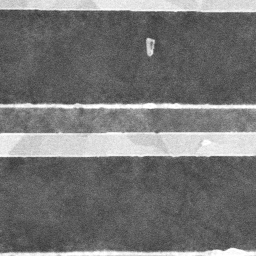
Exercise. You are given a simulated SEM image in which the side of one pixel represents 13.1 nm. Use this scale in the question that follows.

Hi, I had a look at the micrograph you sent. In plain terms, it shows lines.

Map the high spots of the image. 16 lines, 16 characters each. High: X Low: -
-XXXXXXXXXXXXXXX
----------------
----------------
----------------
----------------
----------------
----------------
XXXXXXXXXXXXXXXX
XXXXXXXXXXXXXXXX
XXXXXXXXXXXXXXXX
----------------
----------------
----------------
----------------
----------------
----------------